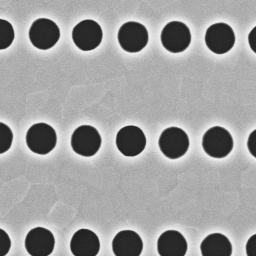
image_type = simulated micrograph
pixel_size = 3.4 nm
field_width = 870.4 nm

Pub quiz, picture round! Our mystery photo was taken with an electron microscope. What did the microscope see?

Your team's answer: a regular array of holes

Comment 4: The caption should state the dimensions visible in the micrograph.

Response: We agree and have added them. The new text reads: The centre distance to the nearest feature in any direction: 148 nm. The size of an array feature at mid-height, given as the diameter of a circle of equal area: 30.4 px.